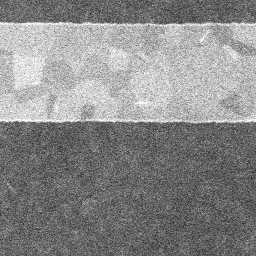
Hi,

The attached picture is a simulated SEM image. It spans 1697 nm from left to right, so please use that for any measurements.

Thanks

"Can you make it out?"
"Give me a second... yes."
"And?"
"one or a few lines or trenches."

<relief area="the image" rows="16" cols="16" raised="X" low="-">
----------------
XXXXXX--------XX
XXXXXXXXXXXXXXXX
XXXXXXXXXXXXXXXX
XXXXXXXXXXXXXXXX
XXXXXXXXXXXXXXXX
XXXXXXXXXXXXXXXX
XXXXXXXXXXXXXXXX
----------------
----------------
----------------
----------------
----------------
----------------
----------------
----------------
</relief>